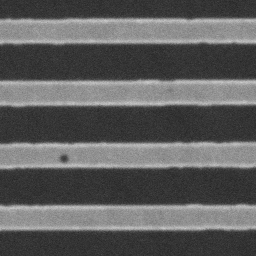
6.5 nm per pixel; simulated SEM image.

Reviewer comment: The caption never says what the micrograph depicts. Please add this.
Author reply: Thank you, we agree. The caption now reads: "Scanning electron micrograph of lines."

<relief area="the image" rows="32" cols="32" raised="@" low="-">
--------------------------------
--------------------------------
--------@@-@@@@@@@@@@-@-@@@@@@@@
@@@@@@@@@@@@@@@@@@@@@@@@@@@@@@@@
@@@@@@@@@@@@@@@@@@@@@@@@@@@@@@@@
--------------------------------
--------------------------------
--------------------------------
--------------------------------
--------------------------------
@@@@@@@@@@@@@@@@@@@@@@@@@@@@@@@@
@@@@@@@@@@@@@@@@@@@@@@@@@@@@@@@@
@@@@@@@@@@@@@@@@@@@@@@@@@@@@@@@@
--------------------------------
--------------------------------
--------------------------------
--------------------------------
--------------------------------
@@@@@@@@@@@@@@@@@@@@@@@@@@@@@@@@
@@@@@@@@@@@@@@@@@@@@@@@@@@@@@@@@
@@@@@@@@@@@@@@@@@@@@@@@@@@@@@@@@
--------------------------------
--------------------------------
--------------------------------
--------------------------------
--------------------------------
@@@@@@@@@@@@@@@@@@@@@@@@@@@@@@@@
@@@@@@@@@@@@@@@@@@@@@@@@@@@@@@@@
@@@@@@@@@@@@@@@@@@@@@@@@@@@@@@@@
--------------------------------
--------------------------------
--------------------------------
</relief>